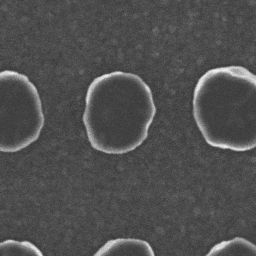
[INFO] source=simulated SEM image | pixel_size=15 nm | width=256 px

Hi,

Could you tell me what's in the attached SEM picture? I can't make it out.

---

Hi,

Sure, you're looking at raised bodies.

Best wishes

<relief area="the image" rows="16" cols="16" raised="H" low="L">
LLLLLLLLLLLLLLLL
LLLLLLLLLLLLLLLL
LLLLLLLLLLLLLLLL
LLLLLLLLLLLLLLLL
LLLLLLLLLLLLLHHL
HHLLLLHHHLLLHHHH
HHHLLHHHHHLLHHHH
HHHLLHHHHLLLHHHH
HHLLLLHHHLLLLHHH
LLLLLLLHLLLLLLLL
LLLLLLLLLLLLLLLL
LLLLLLLLLLLLLLLL
LLLLLLLLLLLLLLLL
LLLLLLLLLLLLLLLL
LLLLLLLLLLLLLLLL
HHLLLLLHHLLLLLHH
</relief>